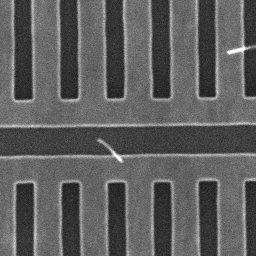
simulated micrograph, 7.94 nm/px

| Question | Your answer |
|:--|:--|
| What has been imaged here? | groups of lines, slits or small figures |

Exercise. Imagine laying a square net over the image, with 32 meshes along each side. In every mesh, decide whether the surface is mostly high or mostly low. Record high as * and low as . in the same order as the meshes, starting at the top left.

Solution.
**..***...***..****..****..***..
**..***...***..****..****..***..
**..***...***..****..****..***..
**..***...***...***..****..***..
**..***...***...***..****..***..
**..***...***...***..****..***..
**..***...***...***..****..***..
**..***...***...***..****..***..
**..***...***...***..****..***..
**..***...***...***..****..***..
**..***...***...***..****..***..
**..***...***...***..****..***..
**..****************************
********************************
********************************
********************************
................................
................................
................................
........****..******************
********************************
********************************
********************************
**..****..***...***..****..****.
**..****..***...***...***..****.
**..****..***...***...***..****.
**..****..***...***...***..****.
**..****..***...***...***..****.
**..****..***...***...***..****.
**..****..***...***...***..****.
**..****..****..***...***..****.
**..****..****..***...***..****.